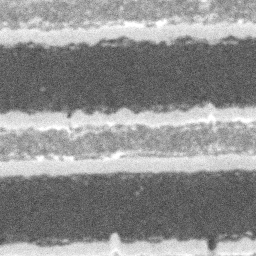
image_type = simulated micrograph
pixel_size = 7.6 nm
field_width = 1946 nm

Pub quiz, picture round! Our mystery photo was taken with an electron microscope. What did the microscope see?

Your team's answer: one or a few lines or trenches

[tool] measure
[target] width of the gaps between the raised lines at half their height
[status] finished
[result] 653 nanometres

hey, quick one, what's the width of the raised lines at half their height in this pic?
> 351 nm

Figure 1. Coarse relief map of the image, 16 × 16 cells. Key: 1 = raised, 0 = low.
1111111111111111
1111111111111111
0000000000000000
0000000000000000
0000000000000000
0000000000000000
0000000000000000
0000000110011111
1111111111111111
1111111111111111
0000000000000000
0000000000000000
0000000000000000
0000000000000000
0000000000000000
0000000000000001